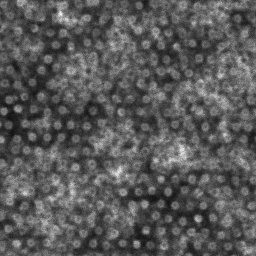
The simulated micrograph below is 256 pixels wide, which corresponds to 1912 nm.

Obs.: a regular array of raised bodies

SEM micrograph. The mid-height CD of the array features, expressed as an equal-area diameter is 0.0499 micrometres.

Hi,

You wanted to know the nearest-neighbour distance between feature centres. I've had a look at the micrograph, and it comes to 0.0984 um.